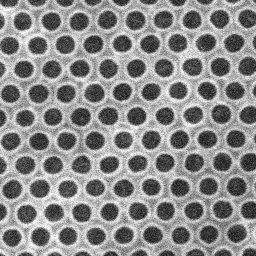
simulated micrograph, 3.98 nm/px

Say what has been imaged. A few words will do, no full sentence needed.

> a regular array of holes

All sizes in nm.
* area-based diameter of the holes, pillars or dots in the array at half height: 77.3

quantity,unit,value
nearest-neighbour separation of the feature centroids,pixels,26.9